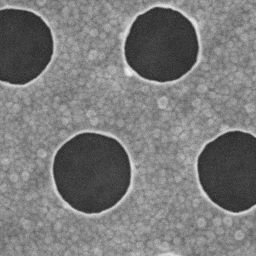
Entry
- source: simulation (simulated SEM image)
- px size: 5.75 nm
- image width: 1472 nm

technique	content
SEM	holes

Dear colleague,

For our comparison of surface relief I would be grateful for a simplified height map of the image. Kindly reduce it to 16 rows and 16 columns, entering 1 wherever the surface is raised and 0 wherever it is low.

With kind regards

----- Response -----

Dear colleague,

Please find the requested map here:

1111111111111111
0001111100001111
0001111100001111
0001111100001111
0001111100001111
1111111111111111
1111111111111111
1111111111111111
1111100111111100
1111000011111000
1110000011110000
1110000011111000
1111000011111000
1111111111111111
1111111111111111
1111111111111111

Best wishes